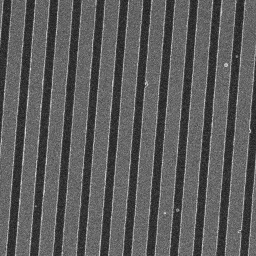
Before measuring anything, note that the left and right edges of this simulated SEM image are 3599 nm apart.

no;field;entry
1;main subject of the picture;parallel lines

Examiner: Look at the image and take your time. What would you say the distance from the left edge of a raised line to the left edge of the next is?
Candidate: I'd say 327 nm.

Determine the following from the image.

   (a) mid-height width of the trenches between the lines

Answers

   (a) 193 nm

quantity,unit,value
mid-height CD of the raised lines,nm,135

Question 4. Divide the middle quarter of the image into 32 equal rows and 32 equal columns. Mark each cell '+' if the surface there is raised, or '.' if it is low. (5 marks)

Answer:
.++....++....++...+++...++....++
.++....++....++...+++...++....++
.++....++...+++...++....++....++
.++....++...+++...++....++....++
.++...+++...+++...+++...++....++
.++...+++...++....+++...++....++
+++...+++...++....++....++....++
+++...++....++....++....++....++
+++...++....++....++....++...+++
++....++....++....++....++...+++
++....++....++....++...+++...+++
++....++....++....++...+++...++.
++....++....++...+++...+++...++.
++....++....++...+++...++....++.
++....++....++...+++...++....++.
++....++...+++...++....++....++.
++....++...+++...++....++....++.
++....++...+++...++....++....++.
++...+++...+++...++....++....++.
++...++....++....++....++....++.
++...++....++....++....++....++.
++...++....++....++....++...+++.
+....++....++....++....++...+++.
+....++....++....++...+++...+++.
+....++....++....++...+++...++..
+....++....++...+++...+++...++..
+....++....++...+++...++....++..
+....++...+++...+++...++....++..
+....++...+++...++....++....++..
+...+++...+++...++....++....++..
+....++...++....++....++....++..
+...+++...++....++....++....++..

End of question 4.